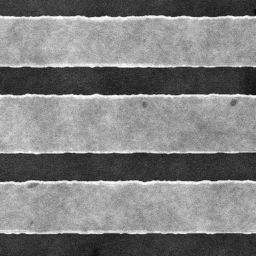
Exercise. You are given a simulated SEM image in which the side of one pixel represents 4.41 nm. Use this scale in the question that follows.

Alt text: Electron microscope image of lines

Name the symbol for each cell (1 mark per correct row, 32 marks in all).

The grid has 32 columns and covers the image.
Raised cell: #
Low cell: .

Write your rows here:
................................
................................
################################
################################
################################
################################
################################
################################
................................
................................
................................
................................
################################
################################
################################
################################
################################
################################
################################
................................
................................
................................
................................
################################
################################
################################
################################
################################
################################
................................
................................
................................